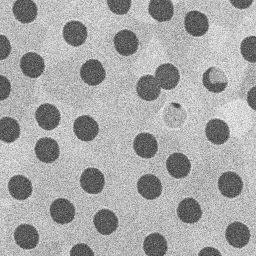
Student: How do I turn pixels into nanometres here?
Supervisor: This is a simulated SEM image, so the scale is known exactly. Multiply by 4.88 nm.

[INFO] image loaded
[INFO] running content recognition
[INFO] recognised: a regular array of holes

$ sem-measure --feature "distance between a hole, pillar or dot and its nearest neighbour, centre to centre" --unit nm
211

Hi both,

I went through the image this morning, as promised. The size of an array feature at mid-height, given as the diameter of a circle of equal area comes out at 128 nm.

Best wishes